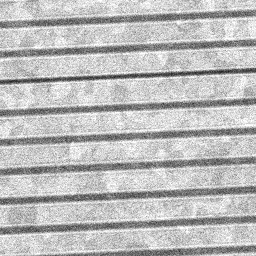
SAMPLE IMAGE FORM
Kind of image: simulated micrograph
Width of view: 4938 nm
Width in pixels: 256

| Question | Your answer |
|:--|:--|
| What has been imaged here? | parallel lines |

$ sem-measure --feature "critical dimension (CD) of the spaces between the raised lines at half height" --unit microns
0.154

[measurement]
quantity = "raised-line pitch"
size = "567 nm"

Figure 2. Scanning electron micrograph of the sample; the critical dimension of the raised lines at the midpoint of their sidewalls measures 409 nanometres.